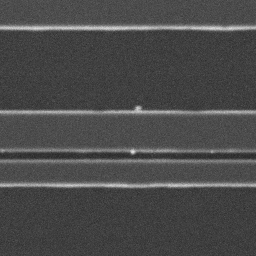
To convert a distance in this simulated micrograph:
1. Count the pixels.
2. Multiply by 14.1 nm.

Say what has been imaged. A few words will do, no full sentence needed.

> lines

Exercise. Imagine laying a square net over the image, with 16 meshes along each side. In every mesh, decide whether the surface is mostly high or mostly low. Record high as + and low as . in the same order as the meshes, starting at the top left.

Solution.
++++++++++++++++
++++++++++++++++
................
................
................
................
................
++++++++++++++++
++++++++++++++++
++++++++++++++++
++++++++++++++++
++++++++++++++++
................
................
................
................